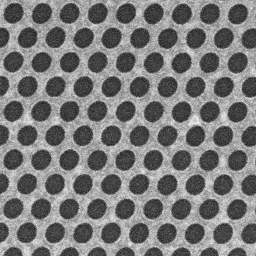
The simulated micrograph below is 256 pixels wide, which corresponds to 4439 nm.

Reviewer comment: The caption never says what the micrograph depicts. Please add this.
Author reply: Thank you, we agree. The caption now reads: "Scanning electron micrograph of a regular array of holes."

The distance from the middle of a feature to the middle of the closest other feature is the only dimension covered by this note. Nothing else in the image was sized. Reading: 27.8 px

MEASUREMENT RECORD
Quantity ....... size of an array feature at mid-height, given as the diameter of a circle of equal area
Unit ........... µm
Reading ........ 0.365